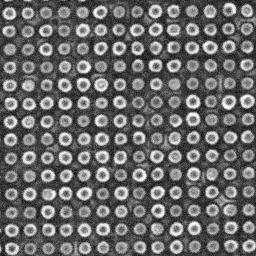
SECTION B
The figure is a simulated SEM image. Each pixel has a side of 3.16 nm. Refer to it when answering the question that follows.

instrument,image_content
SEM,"a regular array of raised bodies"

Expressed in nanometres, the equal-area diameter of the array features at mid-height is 37.4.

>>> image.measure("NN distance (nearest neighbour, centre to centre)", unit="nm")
56.1